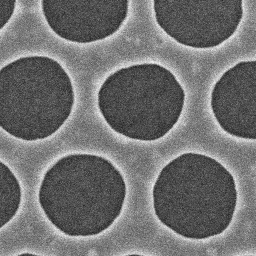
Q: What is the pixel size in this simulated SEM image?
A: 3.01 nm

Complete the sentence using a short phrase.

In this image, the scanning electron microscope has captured holes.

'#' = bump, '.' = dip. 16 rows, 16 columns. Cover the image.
.##.....##.....#
###.....##.....#
####..#####...##
################
....###....###..
.....#.....##...
.....#.....##...
....###....###..
#..#####..#####.
################
###....###....##
.##.....##.....#
.#......##.....#
.##....###.....#
####..#####...##
################